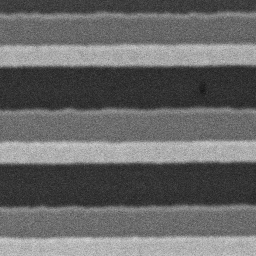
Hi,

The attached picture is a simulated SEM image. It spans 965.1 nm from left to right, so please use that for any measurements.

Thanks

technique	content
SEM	lines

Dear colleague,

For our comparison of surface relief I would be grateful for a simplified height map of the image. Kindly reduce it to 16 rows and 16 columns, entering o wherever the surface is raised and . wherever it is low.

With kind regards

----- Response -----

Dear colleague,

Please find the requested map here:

................
oooooooooooooooo
oooooooooooooooo
oooooooooooooooo
................
................
................
oooooooooooooooo
oooooooooooooooo
oooooooooooooooo
................
................
................
oooooooooooooooo
oooooooooooooooo
oooooooooooooooo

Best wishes